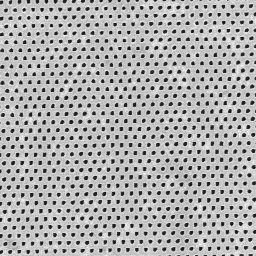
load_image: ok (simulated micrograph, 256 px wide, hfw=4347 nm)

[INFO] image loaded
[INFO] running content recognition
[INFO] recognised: a regular array of holes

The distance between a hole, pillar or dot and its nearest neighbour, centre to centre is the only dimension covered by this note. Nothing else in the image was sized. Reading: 8.97 pixels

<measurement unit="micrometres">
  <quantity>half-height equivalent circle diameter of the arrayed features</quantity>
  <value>0.0742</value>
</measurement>